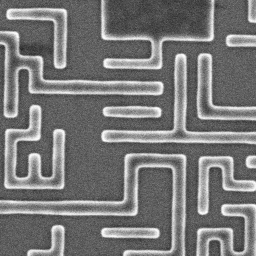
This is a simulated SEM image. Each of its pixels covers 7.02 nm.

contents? wiring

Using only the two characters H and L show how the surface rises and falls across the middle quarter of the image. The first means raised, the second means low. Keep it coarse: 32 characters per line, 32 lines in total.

LLLLLLLLLLHHHHHHHHHHHHHHLLLLHHLL
LLLLLLLLLLLLLLLLLLLLLLLLLLLLHHLL
LLLLLLLLLLLLLLLLLLLLLLLLLLLLHHLL
LLLLLLLLLLLLLLLLLLLLLLLLLLLLHHLL
HHHHHHHHHLLLLHHHLLLLLLLLLLLLHHLL
HHHHHHHHHHHHHHHHHHHHHHHHLLLLHHLL
HHHHHHHHHHHHHHHHHHHHHHHHLLLLHHLL
LLLLLLLLLLLLLLLLLLLLLLHHLLLLHHLL
LLLLLLLLLLLLLLLLLLLLLLLLLLLLHHLL
LLLLLLLLLLLLLLLLLLLLLLLLLLLLHHLL
LLLLLLLLLLLLLLLLLLLLLLLLLLLLHHLL
LLLLLLLLLLHHHHHHHHHHHHHHLLLLHHLL
LLLLLLLLLLHHHHHHHHHHHHHHLLLLHHLL
LLLLLLLLLLLLLLLLLLLLLLLLLLLLHHLL
LLLLLLLLLLLLLLLLLLLLLLLLLLLLHHLL
LLLLLLLLLLLLLLLLLLLLLLLLLLLLHHLL
LLLLLLLLLLLLLLLLLLLLLLLLLLLHHHLL
LLLLLLLLLLHHHHHHHHHHHHHHHHHHHHHH
LLLLLLLLLLHHHHHHHHHHHHHHHHHHHHHH
LLLLLLLLLLLLLLLLLLLLLLLLLLLLLLLL
LLLLLLLLLLLLLLLLLLLLLLLLLLLLLLLL
LLLLLLLLLLLLLLLLLLLLLLLLLLLLLLLL
LLLLLLLLLLLLLLLLLLLLLLLLLLLLLLLL
LLLLLLLLLLLLLLLHHHHHHHHHHHHHHHLL
LLLLLLLLLLLLLLLHHHHHHHHHHHHHHHLL
LLLLLLLLLLLLLLLHHHHHHHHHHHHHHHLL
LLLLLLLLLLLLLLLHHHHLLLLLLLLHHHLL
LLLLLLLLLLLLLLLHHHLLLLLLLLLHHHLL
LLLLLLLLLLLLLLLHHHLLLLLLLLLHHHLL
LLLLLLLLLLLLLLLHHHLLLLLLLLLHHHLL
LLLLLLLLLLLLLLLHHHLLLLLLLLLHHHLL
LLLLLLLLLLLLLLLHHHLLLLLLLLLHHHLL